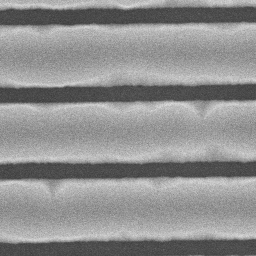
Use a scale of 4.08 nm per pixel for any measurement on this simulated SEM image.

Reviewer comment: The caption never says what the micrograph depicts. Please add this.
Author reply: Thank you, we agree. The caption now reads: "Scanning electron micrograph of lines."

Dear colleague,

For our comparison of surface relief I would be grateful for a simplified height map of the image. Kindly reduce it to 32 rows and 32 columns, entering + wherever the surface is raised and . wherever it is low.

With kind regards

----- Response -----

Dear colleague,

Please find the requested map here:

++++++++++++++++++++++++++++++++
................................
................................
++++++++++++++++++++++++++++++++
++++++++++++++++++++++++++++++++
++++++++++++++++++++++++++++++++
++++++++++++++++++++++++++++++++
++++++++++++++++++++++++++++++++
++++++++++++++++++++++++++++++++
++++++++++++++++++++++++++++++++
++++++++++++++..................
................................
................................
++++++++++++++++++++++++++++++++
++++++++++++++++++++++++++++++++
++++++++++++++++++++++++++++++++
++++++++++++++++++++++++++++++++
++++++++++++++++++++++++++++++++
++++++++++++++++++++++++++++++++
++++++++++++++++++++++++++++++++
................................
................................
..+......+.+++++++++++++++++++++
++++++++++++++++++++++++++++++++
++++++++++++++++++++++++++++++++
++++++++++++++++++++++++++++++++
++++++++++++++++++++++++++++++++
++++++++++++++++++++++++++++++++
++++++++++++++++++++++++++++++++
++++++++++++++++++++++++++++++++
................................
................................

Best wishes